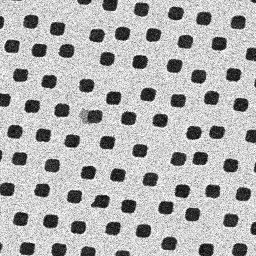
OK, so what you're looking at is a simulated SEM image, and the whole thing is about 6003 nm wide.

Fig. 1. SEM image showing a regular array of holes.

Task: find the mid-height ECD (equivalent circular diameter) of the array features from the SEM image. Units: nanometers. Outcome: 365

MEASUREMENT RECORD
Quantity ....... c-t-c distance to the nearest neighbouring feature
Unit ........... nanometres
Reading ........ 641